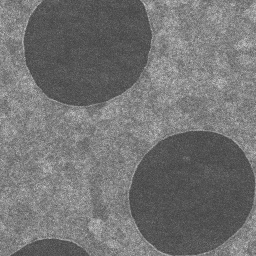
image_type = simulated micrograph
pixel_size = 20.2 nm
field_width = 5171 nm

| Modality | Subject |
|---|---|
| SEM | holes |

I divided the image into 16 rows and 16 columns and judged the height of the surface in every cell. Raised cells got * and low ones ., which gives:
**.......*******
**.......*******
*........*******
**.......*******
**.......*******
**......********
****..**********
****************
***********...**
*********......*
*********.......
********........
********........
********........
*********......*
*....*****....**